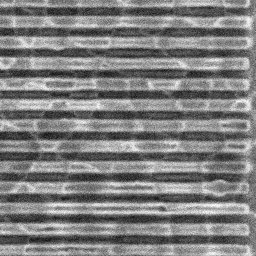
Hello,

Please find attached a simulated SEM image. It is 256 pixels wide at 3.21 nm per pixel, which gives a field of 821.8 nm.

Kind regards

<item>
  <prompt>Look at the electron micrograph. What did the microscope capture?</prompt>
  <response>parallel lines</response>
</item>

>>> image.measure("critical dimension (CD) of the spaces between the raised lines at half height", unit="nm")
31.7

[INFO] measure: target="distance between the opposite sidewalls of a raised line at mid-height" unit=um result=0.0345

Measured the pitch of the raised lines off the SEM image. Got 66.5 nm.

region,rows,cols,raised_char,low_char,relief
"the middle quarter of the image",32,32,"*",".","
********************************
................................
................................
................................
********************************
********************************
*****...........................
................................
................................
********************************
********************************
.****......*****........******.*
................................
................................
********************************
********************************
********************************
................................
................................
*****************************...
********************************
********************************
................................
................................
..**..***.******................
********************************
********************************
................................
................................
.................**.............
********************************
********************************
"